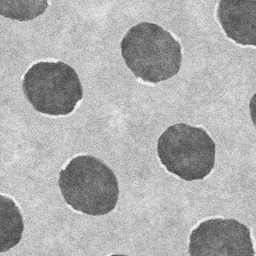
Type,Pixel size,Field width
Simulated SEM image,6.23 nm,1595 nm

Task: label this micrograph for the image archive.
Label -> holes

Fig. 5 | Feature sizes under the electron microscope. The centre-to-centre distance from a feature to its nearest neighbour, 0.648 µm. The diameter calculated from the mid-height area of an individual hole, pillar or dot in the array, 362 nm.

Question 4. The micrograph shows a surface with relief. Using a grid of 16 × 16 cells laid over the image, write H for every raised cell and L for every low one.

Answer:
LLLHHHHHHHHHHHLL
HHHHHHHHHLHHHHLL
HHHHHHHHLLLHHHHL
HHHHHHHHLLLHHHHH
HHLLLHHHLLLHHHHH
HLLLLHHHHHHHHHHH
HHLLLHHHHHHHHHHH
HHHHHHHHHHHHHHHH
HHHHHHHHHHLLLHHH
HHHHHHHHHHLLLHHH
HHHHLLLHHHLLLHHH
HHHHLLLHHHHHHHHH
LHHHLLLHHHHHHHHH
LHHHHHHHHHHHHHHH
LHHHHHHHHHHHLLLL
LHHHHHHHHHHHLLLL